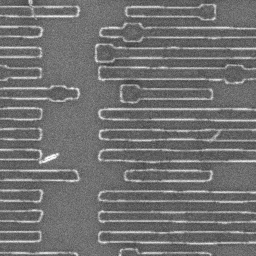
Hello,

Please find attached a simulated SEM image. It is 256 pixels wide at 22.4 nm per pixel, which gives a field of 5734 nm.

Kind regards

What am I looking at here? wiring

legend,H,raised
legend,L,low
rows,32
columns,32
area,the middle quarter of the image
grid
LLLLLLLLLLLLLLLLLLLLLLLLLLLLLLLL
LLLLLLLLLHHHHHHHHHHHHHHHHHHHHHHH
LLLLLLLLLHHHHHHHHHHHHHHHHHHHHHHH
LLLLLLLLLHHHHHHHHHHHHHHHHHHHHHHH
LLLLLLLLLLLLLLLLLLLLLLLLLLLLLLLL
LLLLLLLLLLLLLLLHHHHLLLLLLLLLLLLL
HHHLLLLLLLLLLLHHHHHHHHHHHHHHHHHH
HHHHLLLLLLLLLLHHHHHHHHHHHHHHHHHH
HHHLLLLLLLLLLLHHHHHHHHHHHHHHHHHH
LLLLLLLLLLLLLLLLHHLLLLLLLLLLLLLL
LLLLLLLLLLLLLLLLLLLLLLLLLLLLLLLL
LLLLLLLLLLHHHHHHHHHHHHHHHHHHHHHH
LLLLLLLLLHHHHHHHHHHHHHHHHHHHHHHH
LLLLLLLLLHHHHHHHHHHHHHHHHHHHHHHH
LLLLLLLLLLLLLLLLLLLLLLLLLLLLLLLL
LLLLLLLLLLLLLLLLLLLLLLLLLLLLLLLL
LLLLLLLLLLLLLLLLLLLLLLLLLLLLLLLL
LLLLLLLLLHHHHHHHHHHHHHHHHHHHHHHH
LLLLLLLLLHHHHHHHHHHHHHHHHHHHHHHH
LLLLLLLLLLLLLLLLLLLLLLLLLLLLLLLL
LLLLLLLLLLLLLLLLLLLLLLLLLLLLLLLL
LLLLLLLLLLLLLLLLLLLLLLLLLLLLLLLL
LLLLLLLLLHHHHHHHHHHHHHHHHHHHHHHH
LLLLLLLLLHHHHHHHHHHHHHHHHHHHHHHH
LLLLLLLLLLLLLLLLLLLLLLLLLLLLLLLL
LLLLLLLLLLLLLLLLLLLLLLLLLLLLLLLL
LLLLLLLLLLLLLLLLLLLLHHHHLLLLLLLL
HHHLLLLLLLLLLLLHHHHHHHHHHHHHHHHH
HHHHLLLLLLLLLLLHHHHHHHHHHHHHHHHH
LLLLLLLLLLLLLLLLLLLLLLLLLLLLLLLL
LLLLLLLLLLLLLLLLLLLLLLLLLLLLLLLL
LLLLLLLLLLLLLLLLLLLLLLLLLLLLLLLL